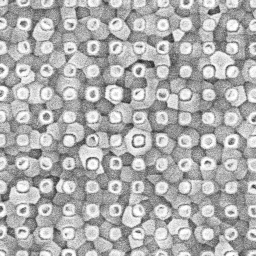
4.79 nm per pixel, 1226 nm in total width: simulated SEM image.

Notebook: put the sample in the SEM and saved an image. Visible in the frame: a regular array of raised bodies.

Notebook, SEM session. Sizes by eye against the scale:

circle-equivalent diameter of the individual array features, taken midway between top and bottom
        55.7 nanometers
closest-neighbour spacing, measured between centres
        56.5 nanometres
